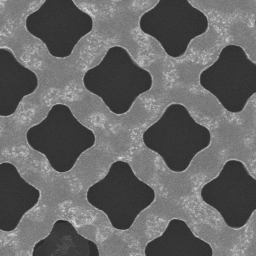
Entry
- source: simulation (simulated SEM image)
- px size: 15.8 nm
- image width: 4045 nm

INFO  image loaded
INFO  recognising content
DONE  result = holes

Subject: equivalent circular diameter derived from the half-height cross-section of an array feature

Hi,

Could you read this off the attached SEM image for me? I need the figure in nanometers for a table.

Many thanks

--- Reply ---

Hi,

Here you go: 932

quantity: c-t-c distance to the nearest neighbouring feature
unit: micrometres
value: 1.28